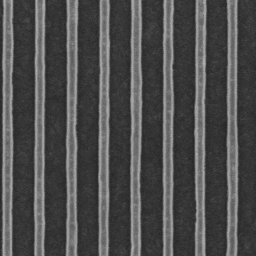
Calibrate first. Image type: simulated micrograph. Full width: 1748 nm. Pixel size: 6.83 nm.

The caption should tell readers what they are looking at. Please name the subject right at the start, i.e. parallel lines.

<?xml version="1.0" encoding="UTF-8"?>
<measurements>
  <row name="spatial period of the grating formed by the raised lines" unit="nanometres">219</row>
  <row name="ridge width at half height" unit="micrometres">0.0529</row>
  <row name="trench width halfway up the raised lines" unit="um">0.171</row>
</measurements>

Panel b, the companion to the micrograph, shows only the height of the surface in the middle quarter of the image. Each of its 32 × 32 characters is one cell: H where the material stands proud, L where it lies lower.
LHHLLLLLLHHLLLLLLHHLLLLLLHHLLLLL
LHHLLLLLLHHLLLLLLHHLLLLLLHHLLLLL
LHHLLLLLLHHLLLLLLHHLLLLLLHHLLLLL
LHHLLLLLLHHLLLLLLHHLLLLLLHHLLLLL
LHHLLLLLLHHLLLLLLHHLLLLLLHHLLLLL
LHHLLLLLLHHLLLLLLHHLLLLLLHHLLLLL
LHHLLLLLLHHLLLLLLHHLLLLLLHHLLLLL
LHHLLLLLLHHLLLLLLHHLLLLLLHHLLLLL
LHHLLLLLLHHLLLLLLHHLLLLLLHHLLLLL
LHHLLLLLLHHLLLLLLHHLLLLLLHHLLLLL
LHHLLLLLLHHLLLLLLHHLLLLLLHHLLLLL
LHHLLLLLLHHLLLLLLHHLLLLLLHHLLLLL
LHHLLLLLLHHLLLLLLHHLLLLLLHHLLLLL
LHHLLLLLLHHLLLLLLHHLLLLLLHHLLLLL
LHHLLLLLLHHLLLLLLHHLLLLLLHHLLLLL
LHHLLLLLLHHLLLLLLHHLLLLLLHHLLLLL
LHHLLLLLLHHLLLLLLHHLLLLLLHHLLLLL
LHHLLLLLLHHLLLLLLHHLLLLLLHHLLLLL
LHHLLLLLLHHLLLLLLHHLLLLLLHHLLLLL
LHHLLLLLLHHLLLLLLHHLLLLLLHHLLLLL
LHHLLLLLLHHLLLLLLHHLLLLLLHHLLLLL
LHHLLLLLLHHLLLLLLHHLLLLLLHHLLLLL
LHHLLLLLLHHLLLLLLHHLLLLLLHHLLLLL
LHHLLLLLLHHLLLLLLHHLLLLLLHHLLLLL
LHHLLLLLLHHLLLLLLHHLLLLLLHHLLLLL
LHHLLLLLLHHLLLLLLHHLLLLLLHHLLLLL
LHHLLLLLLHHLLLLLLHHLLLLLLHHLLLLL
LHHLLLLLLHHLLLLLLHHLLLLLLHHLLLLL
LHHLLLLLLHHLLLLLLHHLLLLLLHHLLLLL
LHHLLLLLLHHLLLLLLHHLLLLLLHHLLLLL
LHHLLLLLLHHLLLLLLHHLLLLLLHHLLLLL
LHHLLLLLLHHLLLLLLHHLLLLLLHHLLLLL